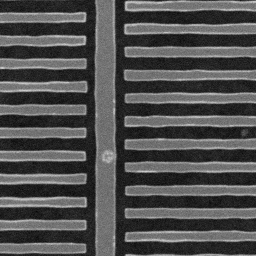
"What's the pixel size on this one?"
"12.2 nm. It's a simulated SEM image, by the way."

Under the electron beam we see groups of lines, slits or small figures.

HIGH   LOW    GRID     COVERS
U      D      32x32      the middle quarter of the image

UUUUUDDDUUUUUDDDDDDDDDDDDDDDDDDD
DDDDDDDDUUUUUDDDDDDDDDDDDDDDDDDD
DDDDDDDDUUUUUDDUUUUUUUUUUUUUUUUU
DDDDDDDDUUUUUDDUUUUUUUUUUUUUUUUU
DDDUUDDDUUUUUDDDDDDDDDDDDDDDDDDD
UUUUUUDDUUUUUDDDDDDDDDDDDDDDDDDD
UUUUUUDDUUUUUDDDDDDDDDDDDDDDDDDD
DDDDDDDDUUUUUDDDDDDDDDDDDDUUUUDD
DDDDDDDDUUUUUDDUUUUUUUUUUUUUUUUU
DDDDDDDDUUUUUDDDUUUUUUUUUUDDDDUU
UUUUUDDDUUUUUDDDDDDDDDDDDDDDDDDD
UUUUUDDDUUUUUDDDDDDDDDDDDDDDDDDD
UUUUUDDDUUUUUDDDDDDDDDDDDDDDDDDD
DDDDDDDDUUUUUDDUUUUUUUUUUUUUUUUU
DDDDDDDDUUUUUDDUUUUUUUUUUUUUUUUU
DDDDDDDDUUUUUDDDDDDDDUUUUDDDDDDD
UUUUUDDDUUUUUDDDDDDDDDDDDDDDDDDD
UUUUUDDDUUUUUDDDDDDDDDDDDDDDDDDD
DDDDDDDDUUUUUDDDDDDDDDDDDDDDDDDD
DDDDDDDDUUUUUDDUUUUUUUUUUUUUUUUU
DDDDDDDDUUUUUDDUUUUUUUUUUUUUUUUU
DDDDDDDDUUUUUDDDDDDDDDDDDDDDDDDD
UUUUUDDDUUUUUDDDDDDDDDDDDDDDDDDD
UUUUUDDDUUUUUDDDDDDDDDDDDDDDDDDD
DDDDDDDDUUUUUDDDDDDDDDDDDDDDDDDD
DDDDDDDDUUUUUDDUUUUUUUUUUUUUUUUU
DDDDDDDDUUUUUDDUUUUUUUUUUUUUUUUU
DDDDUDDDUUUUUDDDDDDDDDDDDDDDDDDD
UUUUUDDDUUUUUDDDDDDDDDDDDDDDDDDD
UUUUUDDDUUUUUDDDDDDDDDDDDDDDDDDD
DDDDDDDDUUUUUDDDDDDDDDDDDDDDDDDD
DDDDDDDDUUUUUDDUUUUUUUUUUUUUUUUU